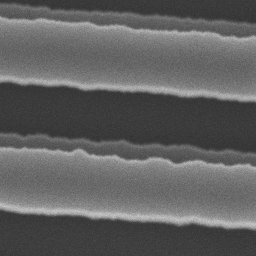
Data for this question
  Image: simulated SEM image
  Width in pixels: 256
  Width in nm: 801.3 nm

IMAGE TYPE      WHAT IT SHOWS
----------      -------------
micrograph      lines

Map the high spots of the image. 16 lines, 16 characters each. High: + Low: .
++..............
+++++++++++++++.
++++++++++++++++
++++++++++++++++
++++++++++++++++
.....+++++++++++
................
................
+...............
+++++++++++++...
++++++++++++++++
++++++++++++++++
++++++++++++++++
.....+++++++++++
................
................